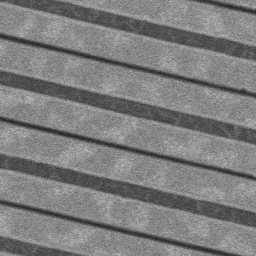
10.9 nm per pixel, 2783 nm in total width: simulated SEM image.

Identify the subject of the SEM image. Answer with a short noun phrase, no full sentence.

parallel lines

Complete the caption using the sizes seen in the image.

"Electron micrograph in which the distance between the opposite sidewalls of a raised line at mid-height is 308 nm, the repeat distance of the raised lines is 438 nm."